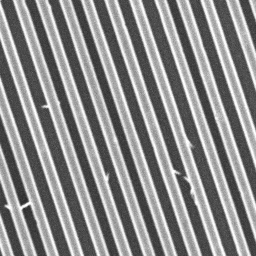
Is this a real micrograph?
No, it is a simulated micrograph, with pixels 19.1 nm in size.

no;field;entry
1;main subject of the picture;parallel lines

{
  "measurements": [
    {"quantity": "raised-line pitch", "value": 430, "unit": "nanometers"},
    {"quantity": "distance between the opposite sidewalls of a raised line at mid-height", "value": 0.19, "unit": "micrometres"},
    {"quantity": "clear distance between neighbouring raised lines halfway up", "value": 247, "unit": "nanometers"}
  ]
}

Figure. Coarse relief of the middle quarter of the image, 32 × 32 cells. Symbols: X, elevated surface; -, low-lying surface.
X----XX---XX----XXX---XXX----XX-
X----XX---XXX---XXX---XXX----XX-
XX---XXX---XX---XXX----XX----XXX
XX---XXX---XX----XXX---XXX---XXX
XX----XX---XXX---XXX---XXX----XX
XXX---XXX---XX---XXX----XX----XX
XXX---XXX---XX----XXX---XXX---XX
-XX----XX---XXX---XXX---XXX----X
-XXX---XXX--XXX---XXX----XX----X
-XXX---XXX---XX----XXX---XXX---X
--XX----XX---XXX---XXX---XXX----
--XXX---XXX--XXX---XXX----XX----
--XXX---XXX---XX----XXX---XXX---
---XX----XX---XXX---XXX---XXX---
---XXX---XXX--XXX---XXX----XX---
X--XXX---XXX---XX----XXX---XXX--
X---XX----XX---XXX---XXX---XXX--
X---XXX---XXX--XXX---XXX----XX--
XX--XXX---XXX---XX----XXX---XXX-
XX---XX----XX---XXX---XXX---XXX-
XX---XXX---XXX--XXX---XXX----XX-
XXX--XXX---XXX---XX----XXX---XXX
XXX---XX----XX---XXX---XXX---XXX
XXX---XXX---XXX--XXX---XXX----XX
-XXX--XXX---XXX---XX----XXX---XX
-XXX---XX----XX---XXX---XXX---XX
-XXX---XXX---XXX--XXX---XXX----X
--XXX--XXX---XXX---XX----XXX---X
--XXX---XXX---XX---XXX---XXX---X
--XXX---XXX---XXX--XXX---XXX---X
---XXX--XXX---XXX---XX----XXX---
---XXX---XX----XX---XXX---XXX---